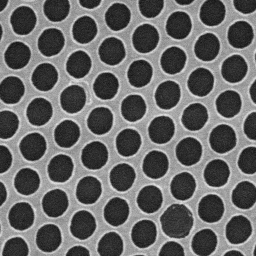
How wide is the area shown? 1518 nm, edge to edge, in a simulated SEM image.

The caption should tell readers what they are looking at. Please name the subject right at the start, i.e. a regular array of holes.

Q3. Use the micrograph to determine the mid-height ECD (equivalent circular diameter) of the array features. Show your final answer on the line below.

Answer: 0.167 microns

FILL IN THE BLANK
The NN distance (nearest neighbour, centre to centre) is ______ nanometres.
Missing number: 207